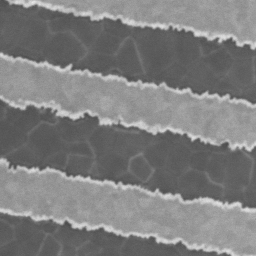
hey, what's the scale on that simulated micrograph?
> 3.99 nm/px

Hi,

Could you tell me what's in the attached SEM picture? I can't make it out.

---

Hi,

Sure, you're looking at one or a few lines or trenches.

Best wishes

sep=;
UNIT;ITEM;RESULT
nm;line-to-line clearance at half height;235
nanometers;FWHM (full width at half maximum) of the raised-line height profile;179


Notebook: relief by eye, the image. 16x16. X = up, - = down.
---XXXXXXXXXXXXX
--------XXXXXXXX
---------------X
----------------
XXXXXX----------
XXXXXXXXXXX-----
-XXXXXXXXXXXXXXX
------XXXXXXXXXX
------------XXXX
----------------
X---------------
XXXXXXX---------
XXXXXXXXXXXXX---
--XXXXXXXXXXXXXX
-------XXXXXXXXX
------------XXXX